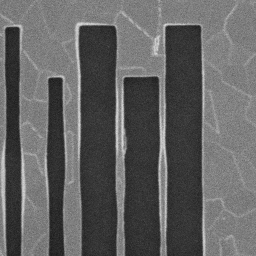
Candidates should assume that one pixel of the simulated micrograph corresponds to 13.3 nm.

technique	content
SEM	groups of lines, slits or small figures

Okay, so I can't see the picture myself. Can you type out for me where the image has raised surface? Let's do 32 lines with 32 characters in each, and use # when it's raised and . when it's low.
################################
################################
################################
#.########....#######....#######
#..#######.....#####.....#######
#..#######.....#####.....#######
#..#######.....######....#######
#..#######.....######....#######
#..#######.....######....#######
#..#######.....######....#######
#..###..##..........#....#######
#..###..##...............#######
#..###..##..........#....#######
#..###..##..........#....#######
#..###..##..........#....#######
#..###..##...............#######
#..###..##...............#######
#..###..##...............#######
#..###..##...............#######
...###..##.....#....#....#######
...###..##..........#....#######
...###..##..........#....#######
...###..##..........#....#######
...###..##..........#....#######
...###..##..........#....#######
...###..##..........#....#######
#..###..##..........#....#######
#..###..##..........#....#######
#..###..##..........#....#######
#..###..##...............#######
#..###..##..........#....#######
#..###..##..........#.....######